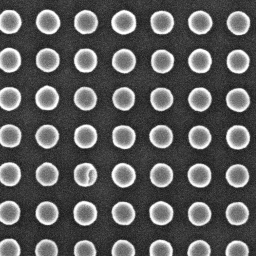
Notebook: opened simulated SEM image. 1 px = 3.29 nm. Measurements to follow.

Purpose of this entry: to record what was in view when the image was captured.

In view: a regular array of raised bodies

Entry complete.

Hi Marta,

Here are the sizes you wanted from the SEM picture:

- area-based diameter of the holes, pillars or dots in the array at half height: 72.7 nm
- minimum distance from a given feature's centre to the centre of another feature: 0.124 microns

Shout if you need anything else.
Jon